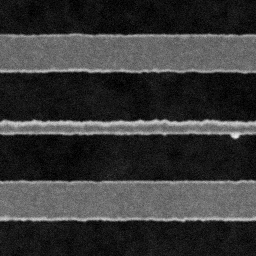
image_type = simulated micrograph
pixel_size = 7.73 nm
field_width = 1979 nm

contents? lines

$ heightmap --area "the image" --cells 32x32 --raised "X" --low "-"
--------------------------------
--------------------------------
--------------------------------
--------------------------------
XXX--XXXXXXXXXXXXXXXXXXXXXXXXXXX
XXXXXXXXXXXXXXXXXXXXXXXXXXXXXXXX
XXXXXXXXXXXXXXXXXXXXXXXXXXXXXXXX
XXXXXXXXXXXXXXXXXXXXXXXXXXXXXXXX
XXXXXXXXXXXXXXXXXXXXXXXXXXXXXXXX
--------------------------------
--------------------------------
--------------------------------
--------------------------------
--------------------------------
--------------------------------
XXXXXXXXXXXXXXXXXXXXXXXXXXXXXXXX
XXXXXXXXXXXXXXXXXXXXXXXXXXXXXXXX
--------------------------------
--------------------------------
--------------------------------
--------------------------------
--------------------------------
--------------------------------
XXXXXXXXXXXXXXXXXXXXXXXXXXXXXXXX
XXXXXXXXXXXXXXXXXXXXXXXXXXXXXXXX
XXXXXXXXXXXXXXXXXXXXXXXXXXXXXXXX
XXXXXXXXXXXXXXXXXXXXXXXXXXXXXXXX
X---XXX--XX--XXX---XXXX--X-XX-X-
--------------------------------
--------------------------------
--------------------------------
--------------------------------